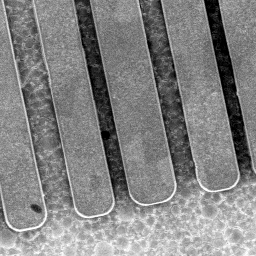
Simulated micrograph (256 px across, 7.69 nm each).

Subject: one or a few lines or trenches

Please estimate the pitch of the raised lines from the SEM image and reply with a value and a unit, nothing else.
488 nanometers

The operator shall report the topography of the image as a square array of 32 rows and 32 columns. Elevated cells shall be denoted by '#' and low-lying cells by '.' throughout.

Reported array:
....#####..######...######.#####
#...#####...######..######..####
#....#####..######...#####..####
#....#####..######...#####..####
#....#####..######...#####..####
#....#####..######...######.####
##...#####...######..######..###
##....#####..######...#####..###
##....#####..######...#####..###
##....#####..######...#####..###
##....#####..######...######.###
###...######..######..######..##
###....#####..######...#####..##
###....#####..######...#####..##
###....#####..######...#####..##
####...#####..######...######..#
####....####...######...#####..#
####....#####..######...#####..#
####....#####..######...#####..#
####....#####..######...#####..#
#####...#####...#####...######..
#####...######..######...#####..
#####....#####..######...#####..
#####....#####..######...####...
#####....#####..#####...........
######...#####....#.............
.#####....####..................
.#####..........................
..##............................
................................
................................
................................